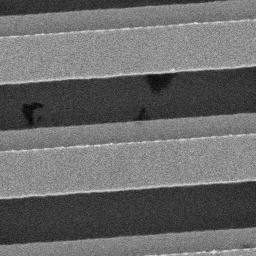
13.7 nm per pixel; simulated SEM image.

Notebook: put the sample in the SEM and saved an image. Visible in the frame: lines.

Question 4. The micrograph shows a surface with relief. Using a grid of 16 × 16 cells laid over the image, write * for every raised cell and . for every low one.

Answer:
........********
****************
****************
****************
***********.....
................
................
..........******
****************
****************
****************
*************...
................
................
............****
****************